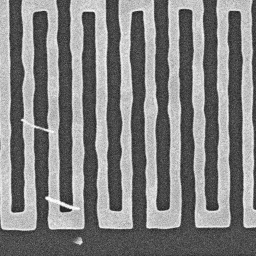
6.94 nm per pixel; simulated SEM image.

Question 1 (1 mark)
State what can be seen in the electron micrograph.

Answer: groups of lines, slits or small figures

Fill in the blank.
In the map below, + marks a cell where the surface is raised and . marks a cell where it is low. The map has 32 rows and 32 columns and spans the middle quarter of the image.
..++....++....+++....++...+++...
..++....+++...+++...+++...+++...
..++....+++...+++...+++...+++...
..++....+++...+++...+++...+++...
..++....+++...+++....++...+++...
..++....+++...+++....++...+++...
..++....+++...+++....++...+++...
..++....+++...+++....++...+++...
..++....+++...+++...+++...+++...
..++....+++...+++...+++...+++...
..++....+++...+++...+++...+++...
..++....+++...+++...+++...+++...
..++....++....+++...+++...+++...
..+++...++.....++...+++...+++...
..+++...+++....++...+++....++...
..+++...+++....++...+++....++...
..+++...+++....++...+++....++...
..+++...+++...+++...+++....++...
..+++...+++...+++...+++....++...
..+++...+++...+++...+++....++...
..+++...+++...+++....++....++...
..+++...+++....++....++....++...
..+++...+++....++....++....++...
..+++...+++...+++....++....++...
..+++....++...+++....++....++...
..+++....++...+++....++....++...
..+++....++...+++....++....++...
..+++...+++....++....++....++...
..+++...+++....++....++....++...
..+++...+++....++....++....++...
..+++...+++....++....++....++...
..+++...+++....++....++....++...